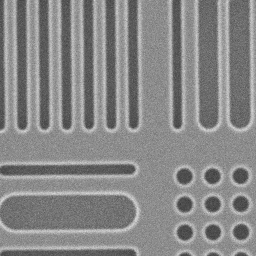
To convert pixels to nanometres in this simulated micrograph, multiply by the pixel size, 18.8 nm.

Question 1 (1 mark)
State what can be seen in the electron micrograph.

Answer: groups of lines, slits or small figures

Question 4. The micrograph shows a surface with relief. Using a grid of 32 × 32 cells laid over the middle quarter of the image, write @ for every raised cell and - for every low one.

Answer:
--@@@---@@---@@@---@@@@@@@@---@@
--@@@---@@---@@@---@@@@@@@@---@@
--@@@---@@---@@@---@@@@@@@@---@@
--@@@---@@---@@@---@@@@@@@@---@@
--@@@---@@---@@@---@@@@@@@@---@@
--@@@---@@---@@@---@@@@@@@@---@@
--@@@---@@---@@@---@@@@@@@@---@@
--@@@---@@---@@@---@@@@@@@@---@@
--@@@---@@---@@@---@@@@@@@@---@@
--@@@---@@---@@@---@@@@@@@@---@@
--@@@---@@---@@@---@@@@@@@@---@@
--@@@---@@---@@@---@@@@@@@@---@@
--@@@---@@---@@@---@@@@@@@@---@@
--@@@---@@---@@@---@@@@@@@@---@@
--@@@---@@---@@@---@@@@@@@@---@@
--@@@---@@@--@@@---@@@@@@@@--@@@
@@@@@@@@@@@@@@@@@@@@@@@@@@@@@@@@
@@@@@@@@@@@@@@@@@@@@@@@@@@@@@@@@
@@@@@@@@@@@@@@@@@@@@@@@@@@@@@@@@
@@@@@@@@@@@@@@@@@@@@@@@@@@@@@@@@
@@@@@@@@@@@@@@@@@@@@@@@@@@@@@@@@
@@@@@@@@@@@@@@@@@@@@@@@@@@@@@@@@
@@@@@@@@@@@@@@@@@@@@@@@@@@@@@@@@
@@@@@@@@@@@@@@@@@@@@@@@@@@@@@@@@
@@@@@@@@@@@@@@@@@@@@@@@@@@@@@@@@
------------------@@@@@@@@@@@@@@
------------------@@@@@@@@@@@--@
------------------@@@@@@@@@@----
@@@@@@@@@@@@@@@@@@@@@@@@@@@@----
@@@@@@@@@@@@@@@@@@@@@@@@@@@@----
@@@@@@@@@@@@@@@@@@@@@@@@@@@@@@@@
@@@@@@@@@@@@@@@@@@@@@@@@@@@@@@@@